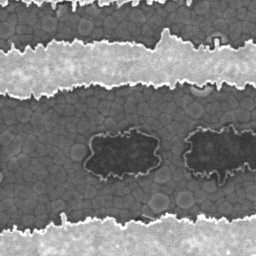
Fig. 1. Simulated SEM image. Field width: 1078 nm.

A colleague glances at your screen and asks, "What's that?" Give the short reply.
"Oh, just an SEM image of one or a few lines or trenches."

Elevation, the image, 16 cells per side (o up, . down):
................
................
..........o.....
oooooooooooooooo
oooooooooooooooo
oooo............
................
................
......ooo...oooo
......oooo..oooo
.....ooooo..oooo
................
................
..........o.....
oooooooooooooooo
oooooooooooooooo